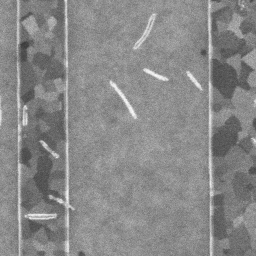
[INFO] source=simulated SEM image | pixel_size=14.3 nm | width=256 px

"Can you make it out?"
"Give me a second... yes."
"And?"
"wiring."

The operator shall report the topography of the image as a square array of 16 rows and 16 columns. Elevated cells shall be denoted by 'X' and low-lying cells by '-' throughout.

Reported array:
-XXX---------XXX
-XXX---------XXX
-XXX---------XXX
-XXX---------XXX
-XXX---------XXX
-XXX---------XXX
-XXX---------XXX
-XXX---------XXX
-XXX---------XXX
-XXX---------XXX
-XXX---------XXX
-XXX---------XXX
-XXX---------XXX
-XXX---------XXX
-XXX---------XXX
-XXX---------XXX